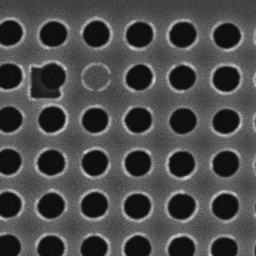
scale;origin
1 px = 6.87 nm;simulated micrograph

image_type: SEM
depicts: a regular array of holes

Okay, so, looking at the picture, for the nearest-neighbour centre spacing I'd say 292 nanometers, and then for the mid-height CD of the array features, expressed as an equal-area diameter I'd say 0.182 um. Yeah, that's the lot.